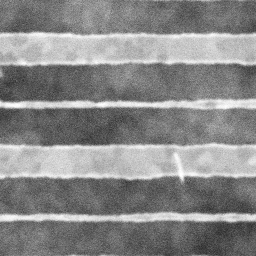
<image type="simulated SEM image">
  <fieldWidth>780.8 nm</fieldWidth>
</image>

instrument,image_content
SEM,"lines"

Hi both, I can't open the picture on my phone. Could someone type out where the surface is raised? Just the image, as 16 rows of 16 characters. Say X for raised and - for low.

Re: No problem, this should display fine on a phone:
----------------
----------------
XXXXXXXXXXXXXXXX
XXXXXXXXXXXXXXXX
----------------
----------------
----------------
----------------
----------------
XXXXXXXXXXXXXXXX
XXXXXXXXXXXXXXXX
----------------
----------------
----------------
----------------
----------------